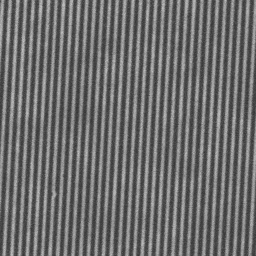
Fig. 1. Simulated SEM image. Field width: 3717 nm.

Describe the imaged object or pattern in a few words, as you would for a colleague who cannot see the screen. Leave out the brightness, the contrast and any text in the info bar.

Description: parallel lines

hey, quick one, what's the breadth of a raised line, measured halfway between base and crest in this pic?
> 41.7 nanometers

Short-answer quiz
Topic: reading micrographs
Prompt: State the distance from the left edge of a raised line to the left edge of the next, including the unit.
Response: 111 nanometers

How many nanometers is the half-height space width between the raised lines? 70.7